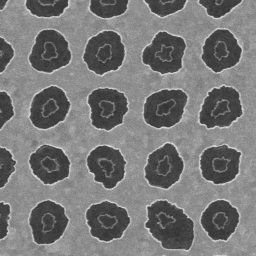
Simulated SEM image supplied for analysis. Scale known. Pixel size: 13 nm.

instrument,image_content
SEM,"a regular array of ring-shaped grooves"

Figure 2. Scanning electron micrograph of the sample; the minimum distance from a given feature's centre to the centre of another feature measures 55.3 px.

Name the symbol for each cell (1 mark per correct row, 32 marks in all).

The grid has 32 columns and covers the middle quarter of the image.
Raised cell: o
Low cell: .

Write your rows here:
oooooo........ooooooo.........oo
ooooooo......ooooooooo.......ooo
oooooooo..oooooooooooooooooooooo
oooooooooooooooooooooooooooooooo
oooooooooooooooooooooooooooooooo
oooooooooooooooooooooooooooooooo
oooooooo.....ooooooooooo..o..ooo
ooooooo......o.ooooooo.........o
.ooooo.......o..ooooo..........o
.ooooo...ooo....oooo.....ooo...o
..oooo...ooo....oooo...ooooo..oo
.oooooo...oo....oooo...oooo...oo
.oooooo..ooo...ooooo...ooo....oo
ooooooo........ooooo..........oo
ooooooo........ooooo.........ooo
ooooooo......ooooooooo.....ooooo
oooooooooooooooooooooooooooooooo
oooooooooooooooooooooooooooooooo
oooooooooooooooooooooooooooooooo
oooooooooooooooooooooooooooooooo
ooooooooo..oooooooooooooo..ooooo
ooooooo.......ooooooooo.....oooo
oooooo........oooooooo.......ooo
.ooooo.........oooooo....o...ooo
.ooooo...ooo...oooooo...oo....oo
.ooooo...ooo...ooooo...oooo...oo
.ooooo....oo...ooooo...ooo....oo
.oooooo...oo...ooooo....oo...ooo
oooooooo.......ooooo.........ooo
oooooooo......ooooooo.......oooo
oooooooooo...ooooooooo.....ooooo
oooooooooooooooooooooooooooooooo